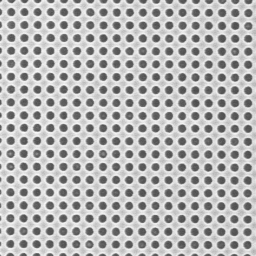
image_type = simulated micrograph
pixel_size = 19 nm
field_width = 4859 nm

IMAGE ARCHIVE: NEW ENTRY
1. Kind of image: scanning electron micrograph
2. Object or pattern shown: a regular array of holes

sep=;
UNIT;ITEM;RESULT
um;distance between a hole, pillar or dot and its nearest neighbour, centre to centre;0.242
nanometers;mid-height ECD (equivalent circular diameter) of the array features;167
